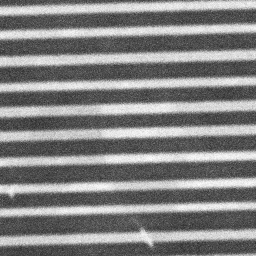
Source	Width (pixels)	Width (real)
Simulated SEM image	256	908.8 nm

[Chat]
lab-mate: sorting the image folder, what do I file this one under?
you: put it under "parallel lines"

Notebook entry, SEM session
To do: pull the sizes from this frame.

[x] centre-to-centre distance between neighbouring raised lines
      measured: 0.0908 um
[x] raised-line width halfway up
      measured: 23 nanometres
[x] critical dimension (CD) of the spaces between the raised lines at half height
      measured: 65.6 nm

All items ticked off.